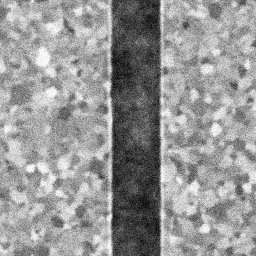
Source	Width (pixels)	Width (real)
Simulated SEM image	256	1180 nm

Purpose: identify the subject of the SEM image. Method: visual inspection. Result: one or a few lines or trenches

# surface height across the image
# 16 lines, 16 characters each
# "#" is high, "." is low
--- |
#######...######
#######...######
#######...######
#######...######
#######...######
#######...######
#######...######
#######...######
#######...######
#######...######
#######...######
#######...######
#######...######
#######...######
#######...######
#######...######